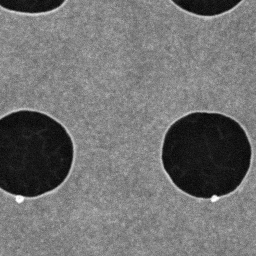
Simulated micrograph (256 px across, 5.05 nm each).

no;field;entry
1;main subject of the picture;holes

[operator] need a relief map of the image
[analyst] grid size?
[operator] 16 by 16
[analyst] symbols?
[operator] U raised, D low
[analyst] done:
DDDDUUUUUUUDDDDU
UUUUUUUUUUUUUUUU
UUUUUUUUUUUUUUUU
UUUUUUUUUUUUUUUU
UUUUUUUUUUUUUUUU
UUUUUUUUUUUUUUUU
UUUUUUUUUUUUUUUU
DDDUUUUUUUUDDDDU
DDDDUUUUUUDDDDDU
DDDDDUUUUUDDDDDD
DDDDUUUUUUDDDDDD
DDDDUUUUUUUDDDDU
UUUUUUUUUUUUUUUU
UUUUUUUUUUUUUUUU
UUUUUUUUUUUUUUUU
UUUUUUUUUUUUUUUU